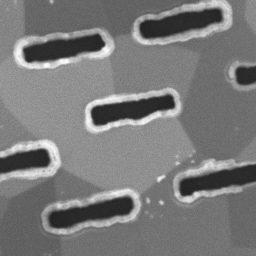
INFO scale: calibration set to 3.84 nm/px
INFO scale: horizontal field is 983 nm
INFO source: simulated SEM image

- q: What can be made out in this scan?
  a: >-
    holes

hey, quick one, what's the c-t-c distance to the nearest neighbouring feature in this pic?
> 367 nm